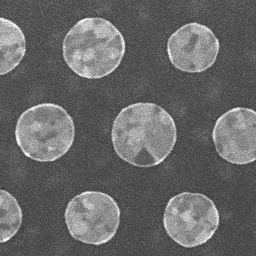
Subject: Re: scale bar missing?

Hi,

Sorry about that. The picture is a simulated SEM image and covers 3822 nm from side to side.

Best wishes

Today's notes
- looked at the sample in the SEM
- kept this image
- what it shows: raised bodies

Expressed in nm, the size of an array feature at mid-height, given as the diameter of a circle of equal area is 830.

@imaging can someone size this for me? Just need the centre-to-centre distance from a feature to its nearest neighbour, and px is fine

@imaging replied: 97.5